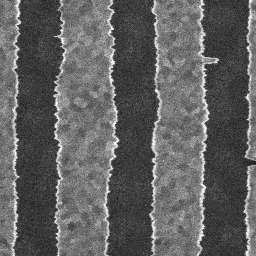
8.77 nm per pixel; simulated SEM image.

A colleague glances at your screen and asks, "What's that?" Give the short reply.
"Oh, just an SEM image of one or a few lines or trenches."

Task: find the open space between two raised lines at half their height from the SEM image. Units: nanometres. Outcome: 384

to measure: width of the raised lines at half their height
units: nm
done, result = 438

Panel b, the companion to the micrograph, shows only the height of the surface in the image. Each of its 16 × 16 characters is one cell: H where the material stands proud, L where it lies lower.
HLLLHHHLLLHHHLLL
HLLLHHHLLLHHHLLL
HLLLHHHLLLHHHLLL
HLLLHHHLLLHHHLLL
HLLLHHHLLLHHHLLL
HLLLHHHLLLHHHLLL
HLLLHHHLLLHHHLLL
HLLLHHHLLLHHHLLL
HLLLHHHLLLHHHLLH
HLLLHHHLLLHHHLLH
HLLLHHHLLLHHHLLL
HLLLHHHLLLHHHLLL
HLLLHHHLLLHHHLLH
HLLHHHHLLLHHHLLH
HLLLHHHLLLHHHLLH
HLLLHHHLLLHHLLLH